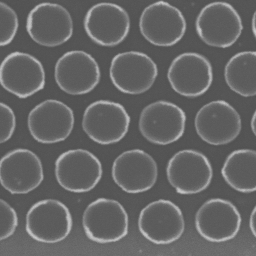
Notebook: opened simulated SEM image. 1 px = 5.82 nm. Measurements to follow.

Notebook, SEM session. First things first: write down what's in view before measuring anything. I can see a regular array of raised bodies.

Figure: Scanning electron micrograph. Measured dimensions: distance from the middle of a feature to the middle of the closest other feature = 0.322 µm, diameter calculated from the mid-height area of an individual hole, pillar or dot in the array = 260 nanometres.